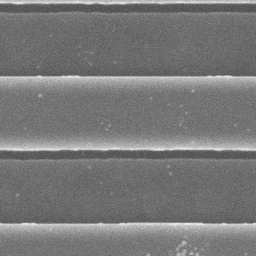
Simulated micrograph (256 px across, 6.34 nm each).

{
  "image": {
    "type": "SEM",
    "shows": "lines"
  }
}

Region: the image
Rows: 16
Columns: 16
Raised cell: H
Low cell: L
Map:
LLLLLLLLLLLLLLLL
LLLLLLLLLLLLLLLL
LLLLLLLLLLLLLLLL
LLLLLLLLLLLLLLLL
LLLLLLLLLLLLLLLL
HHHHHHHHHHHHHHHH
HHHHHHHHHHHHHHHH
HHHHHHHHHHHHHHHH
HHHHHHHHHHHHHHHH
LLLLLLLLLLLLLLLL
LLLLLLLLLLLLLLLL
LLLLLLLLLLLLLLLL
LLLLLLLLLLLLLLLL
LLLLLLLLLLLLLLLL
HHHHHHHHHHHHHHHH
HHHHHHHHHHHHHHHH